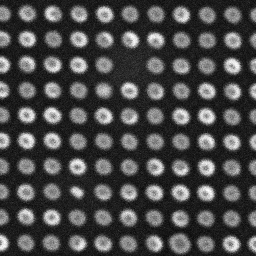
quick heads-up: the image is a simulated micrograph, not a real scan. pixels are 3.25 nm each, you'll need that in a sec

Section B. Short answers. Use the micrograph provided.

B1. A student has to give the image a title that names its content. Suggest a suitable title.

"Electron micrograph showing a regular array of raised bodies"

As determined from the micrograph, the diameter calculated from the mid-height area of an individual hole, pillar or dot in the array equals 49.3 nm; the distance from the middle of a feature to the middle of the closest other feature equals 0.0823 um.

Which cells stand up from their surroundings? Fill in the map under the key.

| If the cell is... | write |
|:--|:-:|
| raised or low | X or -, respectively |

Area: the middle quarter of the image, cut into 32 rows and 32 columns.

--XXX---XXXX---------XXXX--XXXX-
--XXX----XX----------XXXX---XXX-
--------------------------------
--------------------------------
--------------------------------
--XXX---XXX----XXX----XX----XX--
--XXXX--XXXX---XXX---XXXX---XXX-
--XXX---XXXX---XXX---XXXX---XXX-
----------------------XX-----X--
--------------------------------
--------------------------------
--XX-----XX----XX-----XX----XX--
--XXX---XXXX---XXX---XXXX---XXX-
--XXX---XXXX---XXX---XXXX---XXX-
---XX----XX-----X-----XX----XXX-
--------------------------------
--------------------------------
--------------------------------
--XXX---XXX----XXX---XXX---XXXX-
--XXX---XXXX--XXXX---XXXX--XXXX-
--XXX----XX----XXX---XXX----XXX-
--------------------------------
--------------------------------
--------------------------------
--XXX---XXX----XX----XXX----XX--
--XXX---XXXX--XXXX---XXX---XXXX-
--XXX---XXXX---XXX---XXXX--XXXX-
----------------------XX----XX--
--------------------------------
--------------------------------
--------XXX----XX---------------
--XX----XXX---XXXX---XXX---XXXX-